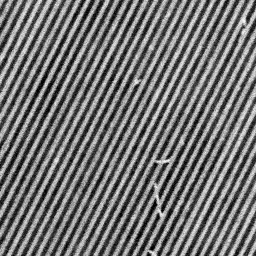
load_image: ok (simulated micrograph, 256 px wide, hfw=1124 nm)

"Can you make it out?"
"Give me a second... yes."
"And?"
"parallel lines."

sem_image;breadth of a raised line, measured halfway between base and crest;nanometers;12.8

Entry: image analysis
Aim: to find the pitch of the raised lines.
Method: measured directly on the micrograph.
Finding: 37.9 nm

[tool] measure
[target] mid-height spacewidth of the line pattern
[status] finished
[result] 24.5 nanometers